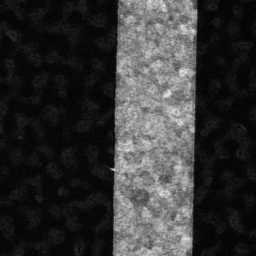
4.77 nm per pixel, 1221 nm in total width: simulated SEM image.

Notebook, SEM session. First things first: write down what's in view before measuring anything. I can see one or a few lines or trenches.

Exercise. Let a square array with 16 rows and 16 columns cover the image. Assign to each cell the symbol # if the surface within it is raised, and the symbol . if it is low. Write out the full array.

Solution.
.......#####....
.......#####....
.......#####....
.......#####....
.......#####....
.......#####....
.......#####....
.......#####....
.......#####....
.......#####....
.......#####....
.......#####....
.......#####....
.......#####....
.......#####....
.......#####....